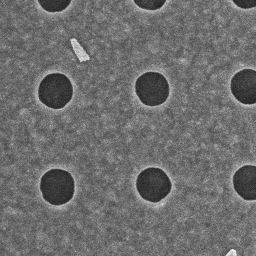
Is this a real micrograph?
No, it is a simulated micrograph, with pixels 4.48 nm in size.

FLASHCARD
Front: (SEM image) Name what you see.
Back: holes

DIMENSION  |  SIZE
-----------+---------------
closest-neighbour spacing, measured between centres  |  0.429 µm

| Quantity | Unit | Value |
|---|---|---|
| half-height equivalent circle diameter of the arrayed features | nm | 159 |